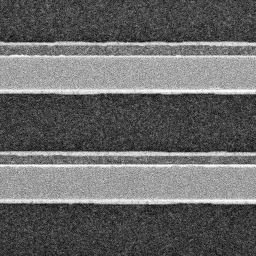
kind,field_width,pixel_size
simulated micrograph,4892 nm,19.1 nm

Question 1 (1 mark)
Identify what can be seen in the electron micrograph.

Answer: lines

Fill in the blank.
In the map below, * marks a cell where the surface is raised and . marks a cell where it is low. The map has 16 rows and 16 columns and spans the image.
................
................
................
****************
****************
****************
................
................
................
................
****************
****************
..........******
................
................
................